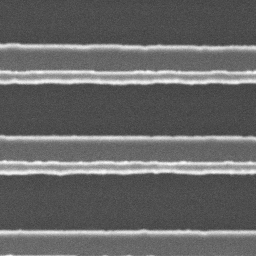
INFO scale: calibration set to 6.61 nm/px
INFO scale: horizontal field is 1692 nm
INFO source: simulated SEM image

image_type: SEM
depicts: lines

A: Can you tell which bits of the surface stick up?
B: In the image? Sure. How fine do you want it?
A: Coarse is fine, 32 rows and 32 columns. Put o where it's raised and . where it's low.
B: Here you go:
................................
................................
................................
................................
................................
................................
oooooooooooooooooooooooooooooooo
oooooooooooooooooooooooooooooooo
oooooooooooooooooooooooooooooooo
oooooooooooooooooooooooooooooooo
................................
................................
................................
................................
................................
................................
................................
oooooooooooooooooooooooooooooooo
oooooooooooooooooooooooooooooooo
oooooooooooooooooooooooooooooooo
oooooooooooooooooooooooooooooooo
oooooooooooooooooooooooooooooooo
................................
................................
................................
................................
................................
................................
................................
oooooooooooooooooooooooooooooooo
oooooooooooooooooooooooooooooooo
oooooooooooooooooooooooooooooooo